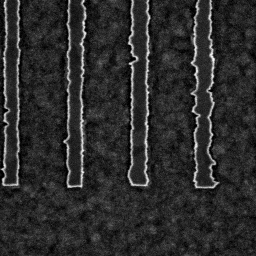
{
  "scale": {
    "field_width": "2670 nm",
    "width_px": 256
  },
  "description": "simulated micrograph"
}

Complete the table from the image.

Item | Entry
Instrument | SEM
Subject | one or a few lines or trenches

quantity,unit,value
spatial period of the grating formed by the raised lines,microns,0.667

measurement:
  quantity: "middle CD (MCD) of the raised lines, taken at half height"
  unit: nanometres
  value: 156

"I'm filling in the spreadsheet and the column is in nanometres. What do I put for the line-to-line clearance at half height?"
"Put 515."